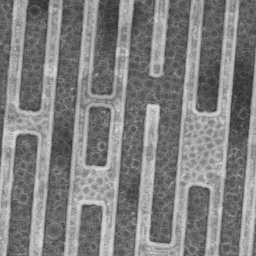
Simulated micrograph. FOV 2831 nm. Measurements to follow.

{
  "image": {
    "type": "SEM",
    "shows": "parallel lines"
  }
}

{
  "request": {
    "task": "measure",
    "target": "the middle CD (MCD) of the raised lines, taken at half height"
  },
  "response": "99.2 nanometres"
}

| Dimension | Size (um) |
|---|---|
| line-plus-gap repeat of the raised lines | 0.389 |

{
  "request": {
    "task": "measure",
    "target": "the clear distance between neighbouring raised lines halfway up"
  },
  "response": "0.287 microns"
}